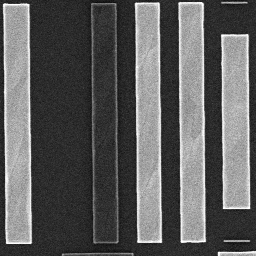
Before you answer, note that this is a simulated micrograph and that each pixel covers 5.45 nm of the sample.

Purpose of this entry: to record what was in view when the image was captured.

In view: wiring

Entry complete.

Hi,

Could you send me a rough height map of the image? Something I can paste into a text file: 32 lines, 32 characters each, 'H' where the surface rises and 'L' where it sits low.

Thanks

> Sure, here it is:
LLHLLLLLLLLLHHLLLHHHLLLHHLLLLLLL
HHHHLLLLLLLHHHLLLHHHLLHHHLLLLLLL
LHHHLLLLLLLHHHLLLHHHLLHHHLLLLLLL
LHHHLLLLLLLHHHLLLHHHLLHHHLLLLLLL
LHHHLLLLLLLHHHLLLHHHLLHHHLLLHHHL
LHHHLLLLLLLLHHLLLHHHLLHHHLLLHHHL
LHHHLLLLLLLLHHLLLHHHLLHHHLLLHHHL
LHHHLLLLLLLLHHLLLHHHLLHHHLLLHHHL
LHHHLLLLLLLLHHLLLHHHLLHHHLLLHHHL
LHHHLLLLLLLLHHHLLHHHLLHHHLLLHHHL
LHHHLLLLLLLLHHHLLHHHLLHHHLLLHHHL
LHHHLLLLLLLLHHHLLHHHLLHHHLLLHHHL
LHHHLLLLLLLLHHHLLHHHLLHHHLLLHHHL
LHHHLLLLLLLLHHHLLHHHLLHHHHLLHHHL
LHHHLLLLLLLLHHHLLHHHLLHHHHLLHHHL
LHHHLLLLLLLLHHHLLHHHLLHHHHLLHHHL
LHHHLLLLLLLLHHHLLHHHLLLHLHLLHHHL
LHHHLLLLLLLLHHHLLHHHLLLHLHLLHHHL
LHHHLLLLLLLLHHHLLHHHLLLHHHLLHHHL
LHHHLLLLLLLLHHHLLHHHLLLHHHLLHHHL
LHHHLLLLLLLLHHHLLHHHLLLHHHLLHHHL
LHHHLLLLLLLLHHHLLHHHLLLHHHLLHHHL
LHHHLLLLLLLLHHHLLHHHLLLHHHLLHHHL
LHHHLLLLLLLLHHHLLHHHLLLHHHLLHHHL
LHHHLLLLLLLLHHHLLHHHLLLHHHLLHHHL
LHHHLLLLLLLLHHHLLHHHLLLHHHLLHHHL
LHHHLLLLLLLLHHHLLHHHLLLHHHLLLLLL
LHHHLLLLLLLLHHHLLHHHLLLHHHLLLLLL
LHHHLLLLLLLLHHHLLHHHLLLHHHLLLLLL
LHHHLLLLLLLLHHHLLHHHLLLHHHLLLLLL
LLLLLLLLLLLLLLLLLLLLLLLLLLLLLLLL
LLLLLLLLLLLLLLLLLLLLLLLLLLLLLLLH